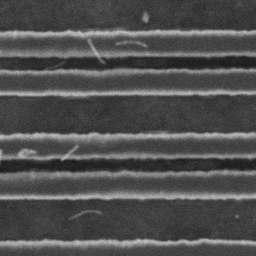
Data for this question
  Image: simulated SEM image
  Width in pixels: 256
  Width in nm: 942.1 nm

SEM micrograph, lines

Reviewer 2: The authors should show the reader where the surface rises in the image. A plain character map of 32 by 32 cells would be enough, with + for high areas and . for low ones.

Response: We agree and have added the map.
................................
................................
................................
................................
++++++++++++++++++++++++++++++++
++++++++++++++++++++++++++++++++
++++++++++++++++++++++++++++++++
................................
................................
++++++++++++++++++++++++++++++++
++++++++++++++++++++++++++++++++
++++++++++++++++++++++++++++++++
................................
................................
................................
................................
................................
++++++++++++++++++++++++++++++++
++++++++++++++++++++++++++++++++
++++++++++++++++++++++++++++++++
................................
...............++.......+.++++++
++++++++++++++++++++++++++++++++
++++++++++++++++++++++++++++++++
++++++++++++++++++++++++++++++++
................................
................................
................................
................................
................................
++++++++++++++++++++++++++++++++
++++++++++++++++++++++++++++++++